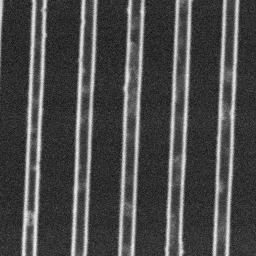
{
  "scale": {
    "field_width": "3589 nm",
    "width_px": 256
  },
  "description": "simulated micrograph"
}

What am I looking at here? parallel lines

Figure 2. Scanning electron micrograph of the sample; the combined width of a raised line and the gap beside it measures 671 nanometers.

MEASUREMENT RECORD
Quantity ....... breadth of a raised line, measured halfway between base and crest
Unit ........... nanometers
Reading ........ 186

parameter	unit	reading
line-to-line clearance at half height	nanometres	476